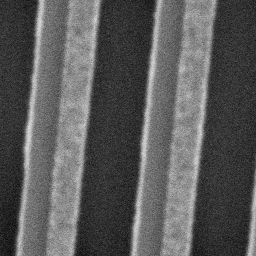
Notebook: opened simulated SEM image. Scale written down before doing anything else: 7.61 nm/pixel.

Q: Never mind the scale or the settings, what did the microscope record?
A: lines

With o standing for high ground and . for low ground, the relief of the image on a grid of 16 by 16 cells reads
...ooo....ooo...
..oooo....ooo...
..oooo....ooo...
..oooo....ooo...
..oooo...oooo...
..oooo...oooo...
..ooo....oooo...
..ooo....oooo...
..ooo....ooo....
..ooo....ooo....
..ooo....ooo....
..ooo....ooo....
.oooo....ooo....
.oooo....ooo....
.oooo...oooo....
.oooo...oooo....